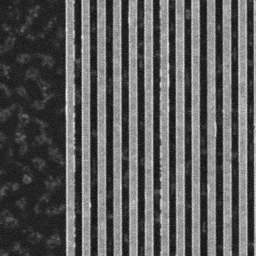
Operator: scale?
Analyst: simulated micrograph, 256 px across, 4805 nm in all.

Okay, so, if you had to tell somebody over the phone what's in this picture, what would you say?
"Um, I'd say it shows parallel lines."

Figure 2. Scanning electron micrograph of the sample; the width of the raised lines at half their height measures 7.87 pixels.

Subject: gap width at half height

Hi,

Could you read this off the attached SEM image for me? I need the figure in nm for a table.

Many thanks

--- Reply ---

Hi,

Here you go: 148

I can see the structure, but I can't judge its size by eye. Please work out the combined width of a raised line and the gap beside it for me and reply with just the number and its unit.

0.294 um